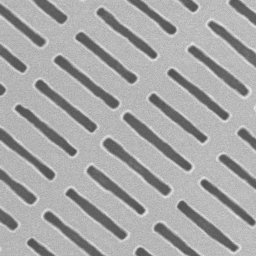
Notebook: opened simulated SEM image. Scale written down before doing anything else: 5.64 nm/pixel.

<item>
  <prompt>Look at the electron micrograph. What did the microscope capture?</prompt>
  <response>a regular array of holes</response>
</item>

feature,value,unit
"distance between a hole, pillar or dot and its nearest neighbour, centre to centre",176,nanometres